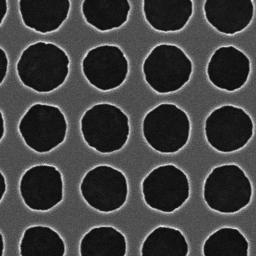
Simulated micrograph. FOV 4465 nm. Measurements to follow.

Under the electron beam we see a regular array of holes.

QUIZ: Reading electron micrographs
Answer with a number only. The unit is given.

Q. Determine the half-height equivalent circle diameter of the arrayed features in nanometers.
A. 812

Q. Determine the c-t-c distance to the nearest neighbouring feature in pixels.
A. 60.2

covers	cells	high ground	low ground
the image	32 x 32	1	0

01000000010000001100000011000000
01100000010000001100000011000000
11100000111000001100000111000001
11110001111100111110000111100001
11111111111111111111111111111111
11110001111111111111111111111111
11100000111000011110000111100011
01000000011000001100000011000001
01000000110000001100000011000001
01000000111000001100000011000001
11100000111100011110000111100011
11111011111111111111011111111111
11111111111111111111111111111111
11110001111000011110001111100011
11100000110000001100000111000001
11000000110000001100000011000000
11100000110000001100000011000000
11100000111000001100000111000001
11110001111100011110000111100011
11111111111111111111111111111111
11111111111111111111111111111111
11100001111000011110000111000011
01100000110000001100000111000001
01100000110000001100000011000001
11100000110000001100000011000001
11100001111000011110000111000001
11111111111111111111111111110111
11111111111111111111111111111111
11110011111100111111011111110111
11100001111000011110000111000011
11100000110000001100000111000001
11100000110000001100000110000001